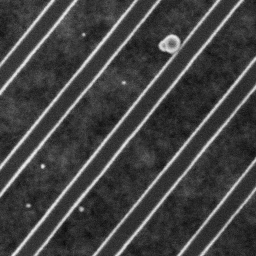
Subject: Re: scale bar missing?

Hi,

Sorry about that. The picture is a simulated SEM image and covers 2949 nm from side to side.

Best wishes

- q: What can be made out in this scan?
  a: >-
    lines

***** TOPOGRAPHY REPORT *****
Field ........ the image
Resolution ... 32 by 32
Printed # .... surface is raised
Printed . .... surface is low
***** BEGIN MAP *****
......###........###.......###..
.....###........###.......###...
.....###.......###.......###....
....###.......###.......###.....
...###.......###........###.....
..###........###....######......
.###........###......####.......
###........###.......###........
###.......###.......###........#
##.......###........###.......##
#.......###........###.......###
........###.......###.......###.
.......###.......###........###.
......###.......###........###..
.....###........###.......###...
....###........###.......###....
....###.......###.......###.....
...###.......###........###.....
..###.......###........###......
.###........##........###.......
###........###.......###.......#
##........###.......###........#
##.......###.......###........##
#.......###........###.......###
........##........###.......###.
.......###.......###.......####.
......###.......###........###..
.....###.......###........###...
....###........###.......###....
....##........###.......###.....
...###.......###.......###......
..###.......###........###......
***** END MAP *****